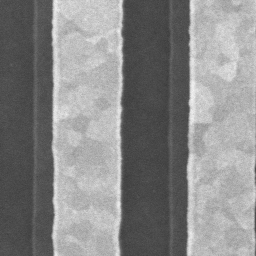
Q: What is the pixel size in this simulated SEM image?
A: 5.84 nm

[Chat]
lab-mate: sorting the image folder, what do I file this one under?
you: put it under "lines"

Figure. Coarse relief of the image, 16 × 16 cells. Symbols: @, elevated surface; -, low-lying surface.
---@@@@@----@@@@
---@@@@@----@@@@
---@@@@@----@@@@
---@@@@@----@@@@
---@@@@@----@@@@
---@@@@@----@@@@
---@@@@@----@@@@
---@@@@@----@@@@
---@@@@@----@@@@
---@@@@@----@@@@
---@@@@@----@@@@
---@@@@@----@@@@
---@@@@@----@@@@
---@@@@@----@@@@
---@@@@-----@@@@
---@@@@-----@@@@